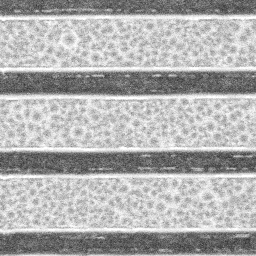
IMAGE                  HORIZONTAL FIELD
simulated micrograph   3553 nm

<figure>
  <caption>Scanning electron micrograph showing one or a few lines or trenches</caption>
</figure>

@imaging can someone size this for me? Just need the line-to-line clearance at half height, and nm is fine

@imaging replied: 366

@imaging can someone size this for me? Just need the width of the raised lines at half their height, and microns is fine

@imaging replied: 0.744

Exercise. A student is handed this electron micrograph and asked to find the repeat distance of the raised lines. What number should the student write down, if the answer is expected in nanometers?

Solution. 1110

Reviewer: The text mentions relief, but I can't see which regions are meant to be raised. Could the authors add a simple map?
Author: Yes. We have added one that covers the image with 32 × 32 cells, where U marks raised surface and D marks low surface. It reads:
DDDDDDDDDDDDDDDDDDDDDDDDDDDDDDDD
DDDDDDDDDDDDDDDDDDDDDDDDDDDDDDDD
UUUUUUUUUUUUUUUUUUUUUUUUUUUUUUUU
UUUUUUUUUUUUUUUUUUUUUUUUUUUUUUUU
UUUUUUUUUUUUUUUUUUUUUUUUUUUUUUUU
UUUUUUUUUUUUUUUUUUUUUUUUUUUUUUUU
UUUUUUUUUUUUUUUUUUUUUUUUUUUUUUUU
UUUUUUUUUUUUUUUUUUUUUUUUUUUUUUUU
UUUUUUUUUUUUUUUUUUUUUUUUUUUUUUUU
DDDDDDDDDDDDDDDDDDDDDDDDDDDDDDDD
DDDDDDDDDDDDDDDDDDDDDDDDDDDDDDDD
DDDDDDDDDDDDDDDDDDDDDDDDDDDDDDDD
UUUUUUUUUUUUUUUUUUUUUUUUUUUUUUUU
UUUUUUUUUUUUUUUUUUUUUUUUUUUUUUUU
UUUUUUUUUUUUUUUUUUUUUUUUUUUUUUUU
UUUUUUUUUUUUUUUUUUUUUUUUUUUUUUUU
UUUUUUUUUUUUUUUUUUUUUUUUUUUUUUUU
UUUUUUUUUUUUUUUUUUUUUUUUUUUUUUUU
UUUUUUUUUUUUUUUUUUUUUUUUUUUUUUUU
DDDDDDDDDDDDDDDDDDDDDDDDDDDDDDDD
DDDDDDDDDDDDDDDDDDDDDDDDDDDDDDDD
DDDDDDDDDDDDDDDDDDDDDDDDDDDDDDDD
UUUUUUUUUUUUUUUUUUUUUUUUUUUUUUUU
UUUUUUUUUUUUUUUUUUUUUUUUUUUUUUUU
UUUUUUUUUUUUUUUUUUUUUUUUUUUUUUUU
UUUUUUUUUUUUUUUUUUUUUUUUUUUUUUUU
UUUUUUUUUUUUUUUUUUUUUUUUUUUUUUUU
UUUUUUUUUUUUUUUUUUUUUUUUUUUUUUUU
UUUUUUUUUUUUUUUUUUUUUUUUUUUUUUUU
DDDDDDDDDDDDDDDDDDDDDDDDDDDDDDDD
DDDDDDDDDDDDDDDDDDDDDDDDDDDDDDDD
DDDDDDDDDDDDDDDDDDDDDDDDDDDDDDDD